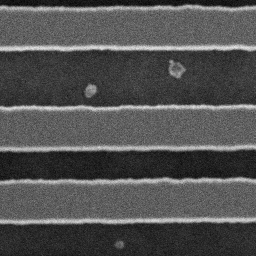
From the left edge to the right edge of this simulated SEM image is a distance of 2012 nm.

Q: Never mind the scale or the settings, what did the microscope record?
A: lines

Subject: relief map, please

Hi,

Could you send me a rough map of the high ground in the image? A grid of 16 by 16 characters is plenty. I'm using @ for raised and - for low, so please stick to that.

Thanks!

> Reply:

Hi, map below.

@@@@@@@@@@@@@@@@
@@@@@@@@@@@@@@@@
@@@@@@@@@@@@@@@@
----------------
----------------
----------------
----------------
@@@@@@@@@@@@@@@@
@@@@@@@@@@@@@@@@
----------------
----------------
@@@@@@@@@@@@@@@@
@@@@@@@@@@@@@@@@
@@@@@@@@@@@@@@@@
----------------
----------------